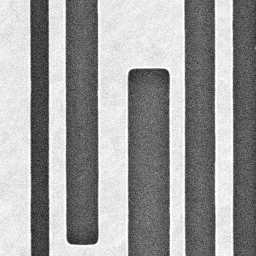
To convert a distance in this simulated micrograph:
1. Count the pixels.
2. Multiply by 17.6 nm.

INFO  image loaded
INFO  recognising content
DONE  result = groups of lines, slits or small figures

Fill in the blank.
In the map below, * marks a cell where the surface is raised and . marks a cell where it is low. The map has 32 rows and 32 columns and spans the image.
****..**....***********....**...
****..**....***********....**...
****..**....***********....**...
****..**....***********....**...
****..**....***********....**...
****..**....***********....**...
****..**....***********....**...
****..**....***********....**...
****..**....*****...***....**...
****..**....****.....**....**...
****..**....****.....**....**...
****..**....****.....**....**...
****..**....****.....**....**...
****..**....****.....**....**...
****..**....****.....**....**...
****..**....****.....**....**...
****..**....****.....**....**...
****..**....****.....**....**...
****..**....****.....**....**...
****..**....****.....**....**...
****..**....****.....**....**...
****..**....****.....**....**...
****..**....****.....**....**...
****..**....****.....**....**...
****..**....****.....**....**...
****..**....****.....**....**...
****..**....****.....**....**...
****..**....****.....**....**...
****..**....****.....**....**...
****..**....****.....**....**...
****..***...****.....**....**...
****..**********.....**....**...